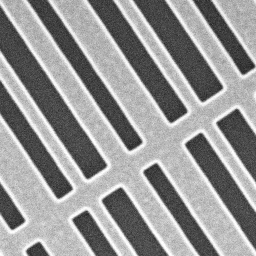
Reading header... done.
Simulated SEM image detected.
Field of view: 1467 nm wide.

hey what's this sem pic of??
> groups of lines, slits or small figures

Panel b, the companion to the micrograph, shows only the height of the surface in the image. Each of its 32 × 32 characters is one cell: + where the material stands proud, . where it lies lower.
++++..+++++....++....+++...+++++
.+++...+++++...+++....+++...++++
.++++...++++....++....++++..++++
..++++..+++++....++....+++...+++
...+++...+++++...+++....+++...++
...++++...++++....++.....+++..++
....++++..+++++....++....+++...+
+....+++...+++++...+++....+++...
+....++++...++++....++....++++..
++....++++...++++....++....+++++
.++....+++...+++++...+++....++++
.++....++++...++++....++....++++
..++....++++...++++....++.++++++
...++....+++...+++++...++++++.++
...++....++++...+++++..+++++..++
+...++....++++..+++++++++++....+
+....++....+++...+++++++++++....
++...++....++++...++++++..++....
+++...++....++++.++++++....++...
+++....++....+++++++++++...+++..
++++...++....++++++.+++++...++..
+++++...++...+++++...++++....++.
+++++....+++++++++...+++++...+++
.+++++...++++++++++...+++++...++
.++++++.+++++...++++...++++....+
..+++++++++++....+++...+++++...+
...+++++++.++....++++...+++++...
...++++++...++....++++...++++...
+.+++++++....++....+++...+++++..
++++++++++...++....++++...+++++.
++++.++++++...++....++++...++++.
+++...+++++....++....+++...+++++